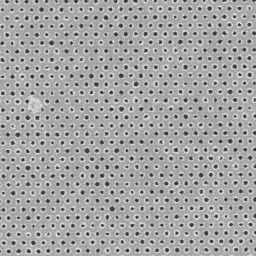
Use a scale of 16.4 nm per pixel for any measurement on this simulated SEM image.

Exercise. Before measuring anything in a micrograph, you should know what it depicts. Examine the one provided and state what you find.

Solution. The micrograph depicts a regular array of holes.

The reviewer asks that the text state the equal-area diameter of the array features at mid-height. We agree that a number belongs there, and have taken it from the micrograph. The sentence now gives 63.9 nm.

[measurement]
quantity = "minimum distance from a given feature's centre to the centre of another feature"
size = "151 nm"